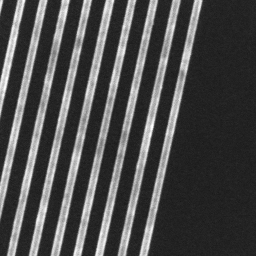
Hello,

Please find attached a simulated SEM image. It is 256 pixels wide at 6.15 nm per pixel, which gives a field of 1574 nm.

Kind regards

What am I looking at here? parallel lines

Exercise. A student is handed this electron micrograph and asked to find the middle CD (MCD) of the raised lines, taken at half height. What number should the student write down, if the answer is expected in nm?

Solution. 43.6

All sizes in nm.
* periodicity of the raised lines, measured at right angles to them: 133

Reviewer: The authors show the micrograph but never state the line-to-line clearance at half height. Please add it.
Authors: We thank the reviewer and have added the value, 87.2 nanometres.